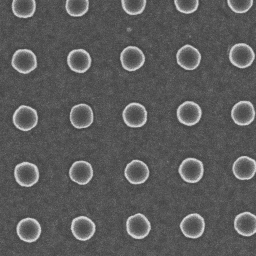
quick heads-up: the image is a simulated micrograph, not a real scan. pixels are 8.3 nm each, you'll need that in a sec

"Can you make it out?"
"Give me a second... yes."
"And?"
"a regular array of raised bodies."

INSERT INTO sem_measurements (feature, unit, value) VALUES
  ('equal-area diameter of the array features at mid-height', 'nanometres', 191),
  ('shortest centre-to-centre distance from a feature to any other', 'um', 0.449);